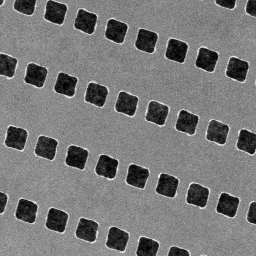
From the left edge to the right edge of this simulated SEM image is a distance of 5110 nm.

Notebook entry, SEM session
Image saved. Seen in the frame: a regular array of holes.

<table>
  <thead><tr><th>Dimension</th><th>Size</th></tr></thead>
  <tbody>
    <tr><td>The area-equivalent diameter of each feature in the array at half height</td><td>460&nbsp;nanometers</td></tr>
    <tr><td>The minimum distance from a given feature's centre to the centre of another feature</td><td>632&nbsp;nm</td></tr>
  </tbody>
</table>